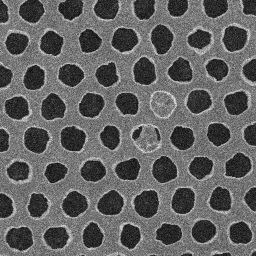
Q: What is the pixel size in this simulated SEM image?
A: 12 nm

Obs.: a regular array of holes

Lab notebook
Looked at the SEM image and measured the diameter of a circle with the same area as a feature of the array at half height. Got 0.29 µm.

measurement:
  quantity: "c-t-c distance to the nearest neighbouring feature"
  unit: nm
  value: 431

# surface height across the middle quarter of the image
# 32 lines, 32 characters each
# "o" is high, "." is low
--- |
...oooooo....ooooo.....oooo.....
.....ooo.....oooo......ooo......
.....ooo.....oooo......ooo......
.....ooo......ooo......oooo.....
....ooooo....ooooo.....oooooo..o
o..ooooooo..oooooooooooooooooooo
oooooooooooooooooooooooooooooooo
ooooo....ooooo...oooooooooooooo.
ooooo.....ooo.....ooooooooooooo.
oooo......ooo......oooooooooooo.
.ooo......ooo......oooooooooooo.
ooo......ooooo.....oooooooooooo.
oooo.....ooooo....oooooooooooooo
oooooooooooooooooooooooooooooooo
oooooooooooooooooooooooooooooooo
oooooooooo...oooooo...oooooooooo
.....ooooo....oooo......oooo....
.....oooo.....ooo.......ooo.....
.....oooo.....ooo.......oo......
.....oooo.....oooo......ooo.....
.....ooooo...ooooo......ooo.....
o...ooooooooooooooooo..oooooo.oo
oooooooooooooooooooooooooooooooo
oooooooooooooooooooooooo..oooooo
ooooo....ooooo.....oooo....ooooo
oooo......ooo......ooo......ooo.
.ooo.......oo......ooo......ooo.
.ooo.......oo......ooo......oooo
ooooo.....oooo....ooooo.....oooo
oooooooooooooooooooooooo..oooooo
oooooooooooooooooooooooooooooooo
oooooooooooooooooooooooooooo....